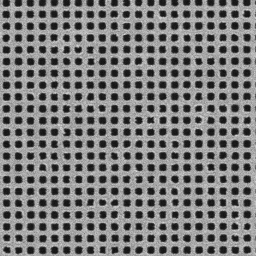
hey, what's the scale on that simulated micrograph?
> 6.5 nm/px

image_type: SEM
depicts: a regular array of holes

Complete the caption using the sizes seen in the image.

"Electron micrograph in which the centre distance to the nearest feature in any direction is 11.6 px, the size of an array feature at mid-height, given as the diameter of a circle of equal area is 51.3 nanometres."